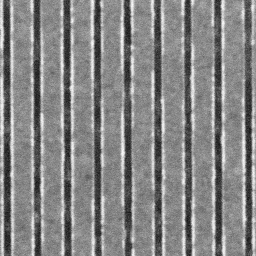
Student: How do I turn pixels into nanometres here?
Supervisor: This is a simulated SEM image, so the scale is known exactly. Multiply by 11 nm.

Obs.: parallel lines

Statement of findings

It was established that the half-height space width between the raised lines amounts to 84.9 nm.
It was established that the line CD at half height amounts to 248 nm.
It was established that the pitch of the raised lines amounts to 330 nm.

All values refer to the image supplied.